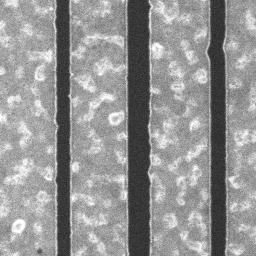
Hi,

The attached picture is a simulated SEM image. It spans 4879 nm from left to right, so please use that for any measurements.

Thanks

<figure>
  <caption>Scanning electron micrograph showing one or a few lines or trenches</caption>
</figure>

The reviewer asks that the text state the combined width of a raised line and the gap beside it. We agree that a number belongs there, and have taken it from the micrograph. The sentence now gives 77.1 pixels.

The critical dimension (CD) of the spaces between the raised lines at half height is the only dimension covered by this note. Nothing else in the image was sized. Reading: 55.6 pixels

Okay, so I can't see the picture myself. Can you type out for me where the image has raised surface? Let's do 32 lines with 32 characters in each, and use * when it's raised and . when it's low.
.......**.......***.......**....
.......**.......***..*....**....
.......**.......***.......**....
.......**.......***.......**....
.......**.......***.......**....
.......**......****.......**....
.......**.......***.......**....
.......**.......***.......**....
.......**.......***.......**....
.......**.......***.......**....
.......**.......***.......**....
.......**.......***.......**....
.......**.......***.......**....
.......**.......***.......**....
.......**.....*****.......**....
.......**.......***.......**....
.......**.......***.......**....
.......**.......***.......**....
.......**.......***.......**....
.......**.......***.......**....
.......**.......***.......**....
.......**.......***.......**....
.......**.......***.......**....
.......**.......***.......**....
.......**.......***.......**....
.......**.......***.......**....
.......**.......***.......**....
.......**.......***.......**....
..*....**.......***.......**....
.......**.......***.......**....
.......**.......***.....*.**....
.......**.......***.......**....